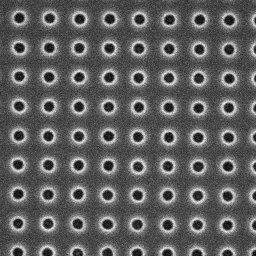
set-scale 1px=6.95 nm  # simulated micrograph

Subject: a regular array of holes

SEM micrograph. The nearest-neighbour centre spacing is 0.203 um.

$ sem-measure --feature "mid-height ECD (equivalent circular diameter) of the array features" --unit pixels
11.6